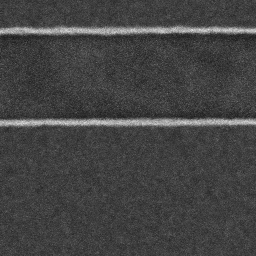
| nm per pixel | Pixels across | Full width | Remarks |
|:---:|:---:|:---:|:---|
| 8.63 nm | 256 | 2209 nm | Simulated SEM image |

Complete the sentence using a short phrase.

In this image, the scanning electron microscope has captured one or a few lines or trenches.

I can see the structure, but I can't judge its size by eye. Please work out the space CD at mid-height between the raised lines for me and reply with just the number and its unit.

0.792 micrometres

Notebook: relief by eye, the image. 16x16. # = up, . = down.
################
################
................
................
................
................
................
................
################
################
################
################
################
################
################
################